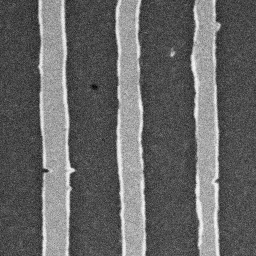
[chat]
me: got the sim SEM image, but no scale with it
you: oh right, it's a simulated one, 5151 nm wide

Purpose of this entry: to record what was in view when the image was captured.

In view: one or a few lines or trenches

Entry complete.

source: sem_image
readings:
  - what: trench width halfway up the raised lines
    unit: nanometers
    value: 1100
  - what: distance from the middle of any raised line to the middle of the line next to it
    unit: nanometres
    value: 1530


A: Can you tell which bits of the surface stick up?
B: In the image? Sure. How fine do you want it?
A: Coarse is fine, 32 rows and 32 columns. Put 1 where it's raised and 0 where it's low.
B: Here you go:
00000111000000011000000011100000
00000111000000011000000011100000
00000111000000011000000001100000
00000111000000011000000001100000
00000111000000011000000011100000
00000111000000011000000011100000
00000111000000011000000011100000
00000111000000011000000011100000
00000111000000011000000011100000
00000111000000011000000011100000
00000111000000011000000011100000
00000111000000011000000001100000
00000111000000011100000001100000
00000111000000011100000001100000
00000111000000011100000001100000
00000111000000011100000001100000
00000111000000011100000001100000
00000011000000011000000001100000
00000011000000011100000001100000
00000011000000011100000001100000
00000011100000011100000001100000
00000011100000011100000001100000
00000011000000011100000001100000
00000011100000011100000001100000
00000111000000011100000001100000
00000011000000011100000001100000
00000111000000011100000001100000
00000011000000011100000001100000
00000011000000011100000001100000
00000011000000001100000001100000
00000011000000001100000001100000
00000011000000001100000001100000